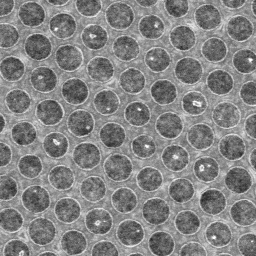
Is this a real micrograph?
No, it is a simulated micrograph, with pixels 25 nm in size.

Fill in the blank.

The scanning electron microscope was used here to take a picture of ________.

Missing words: a regular array of holes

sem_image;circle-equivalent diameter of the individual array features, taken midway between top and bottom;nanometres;657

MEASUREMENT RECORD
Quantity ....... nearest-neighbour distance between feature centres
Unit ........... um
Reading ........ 0.821